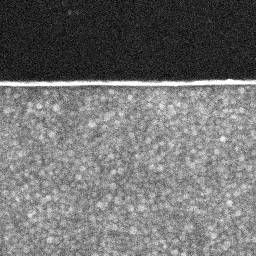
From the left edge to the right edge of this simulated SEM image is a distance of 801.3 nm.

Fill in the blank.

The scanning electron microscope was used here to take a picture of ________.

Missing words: one or a few lines or trenches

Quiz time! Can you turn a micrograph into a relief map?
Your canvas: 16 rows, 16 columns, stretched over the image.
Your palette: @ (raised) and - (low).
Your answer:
@@@@@@@@@@@@@@@@
@@@@@@@@@@@@@@@@
@@@@@@@@@@@@@@@@
@@@@@@@@@@@@@@@@
@@@@@@@@@@@@@@@@
----------------
----------------
----------------
----------------
----------------
----------------
----------------
----------------
----------------
----------------
----------------